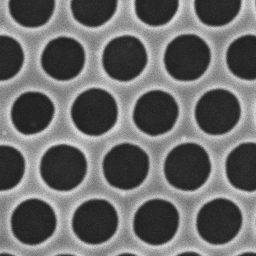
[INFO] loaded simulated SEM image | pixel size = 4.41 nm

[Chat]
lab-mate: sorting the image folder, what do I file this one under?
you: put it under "a regular array of holes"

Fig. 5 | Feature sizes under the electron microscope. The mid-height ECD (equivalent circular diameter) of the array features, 206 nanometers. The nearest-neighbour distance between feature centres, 61.5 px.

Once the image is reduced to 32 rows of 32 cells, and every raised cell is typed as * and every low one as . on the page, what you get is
*......**......**.....**......**
*......**.....***.....**......**
**....***.....****...****....***
********************************
.**************..*****...*****..
..****....***.....***.....***...
...**......**.....***.....**....
...**......**.....**......**....
...**.....***.....***.....***...
..****....****...****....****...
********************************
***..*****...*****...*****...***
**....***.....***.....***.....**
*......**......**.....**......**
*......**......*......**......**
**....***.....***.....***.....**
**...*****...*****...*****...***
********************************
..****....****....****...****...
...**......**......**.....**....
...**......**......**.....**....
...**......**......**.....**....
...**.....***.....***.....***...
..****...******..*****...****...
********************************
**....****....****....****...***
**.....**......**.....***.....**
*......**......**.....**......**
*......**......**.....***.....**
**....****....***.....***....***
***..******.*******.******..****
***********************.********